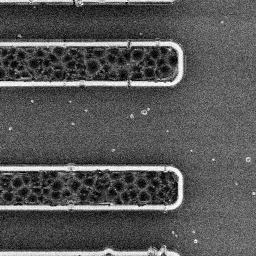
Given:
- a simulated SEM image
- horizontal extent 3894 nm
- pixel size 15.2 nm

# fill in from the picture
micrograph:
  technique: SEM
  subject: one or a few lines or trenches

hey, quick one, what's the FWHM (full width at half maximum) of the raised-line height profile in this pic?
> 599 nanometers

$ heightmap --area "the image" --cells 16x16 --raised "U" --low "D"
DDDDDDDDDDDDDDDD
DDDDDDDDDDDDDDDD
DDDDDDDDDDDDDDDD
UUUUUUUUUUUDDDDD
UUUUUUUUUUUDDDDD
DDDDDDDDDDDDDDDD
DDDDDDDDDDDDDDDD
DDDDDDDDDDDDDDDD
DDDDDDDDDDDDDDDD
DDDDDDDDDDDDDDDD
DDDDUDDDDDDDDDDD
UUUUUUUUUUUDDDDD
UUUUUUUUUUUDDDDD
DDDDDDDDDDDDDDDD
DDDDDDDDDDDDDDDD
DDDDDDDDDDDDDDDD